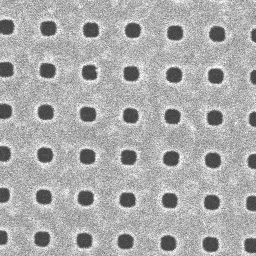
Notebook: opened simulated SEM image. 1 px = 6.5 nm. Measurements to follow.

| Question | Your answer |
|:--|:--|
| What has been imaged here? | a regular array of holes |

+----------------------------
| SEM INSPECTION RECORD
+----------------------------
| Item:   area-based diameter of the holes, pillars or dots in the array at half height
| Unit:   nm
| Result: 107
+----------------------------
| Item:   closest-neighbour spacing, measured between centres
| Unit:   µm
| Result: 0.272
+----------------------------